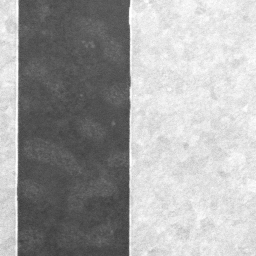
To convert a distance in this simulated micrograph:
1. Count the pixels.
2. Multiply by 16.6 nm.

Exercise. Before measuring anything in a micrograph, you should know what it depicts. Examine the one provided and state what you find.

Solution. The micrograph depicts one or a few lines or trenches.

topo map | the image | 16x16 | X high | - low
X-------XXXXXXXX
X-------XXXXXXXX
X-------XXXXXXXX
X-------XXXXXXXX
X-------XXXXXXXX
X-------XXXXXXXX
X-------XXXXXXXX
X-------XXXXXXXX
X-------XXXXXXXX
X-------XXXXXXXX
X-------XXXXXXXX
X-------XXXXXXXX
X-------XXXXXXXX
X-------XXXXXXXX
X-------XXXXXXXX
X-------XXXXXXXX